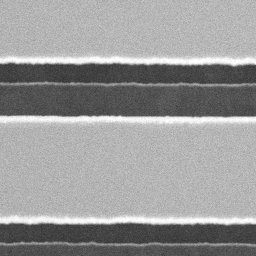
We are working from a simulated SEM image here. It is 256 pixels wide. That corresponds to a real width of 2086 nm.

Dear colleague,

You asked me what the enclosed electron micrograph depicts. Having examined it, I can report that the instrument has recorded lines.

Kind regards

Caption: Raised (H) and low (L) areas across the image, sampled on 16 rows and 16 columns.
HHHHHHHHHHHHHHHH
HHHHHHHHHHHHHHHH
HHHHHHHHHHHHHHHH
HHHHHHHHHHHHHHHH
LLLLLLLLLLLLLLLL
LLLLLLLLLLLLLLLL
LLLLLLLLLLLLLLLL
HHHHHHHHHHHHHHHH
HHHHHHHHHHHHHHHH
HHHHHHHHHHHHHHHH
HHHHHHHHHHHHHHHH
HHHHHHHHHHHHHHHH
HHHHHHHHHHHHHHHH
HHHHHHHHHHHHHHHH
LLLLLLLLLLLLLLLL
LLLLLLLLLLLLLLLL